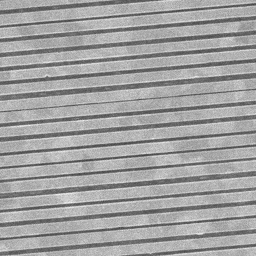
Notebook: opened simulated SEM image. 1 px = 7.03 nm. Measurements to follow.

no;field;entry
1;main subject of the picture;parallel lines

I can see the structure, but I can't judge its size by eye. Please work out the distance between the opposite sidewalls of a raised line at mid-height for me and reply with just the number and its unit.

69.1 nm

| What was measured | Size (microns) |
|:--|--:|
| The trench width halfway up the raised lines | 0.0341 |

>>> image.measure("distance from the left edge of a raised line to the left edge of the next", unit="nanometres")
99.3